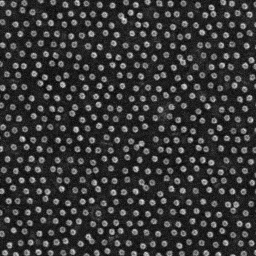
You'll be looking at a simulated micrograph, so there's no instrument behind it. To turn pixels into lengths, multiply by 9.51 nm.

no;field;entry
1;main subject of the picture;a regular array of raised bodies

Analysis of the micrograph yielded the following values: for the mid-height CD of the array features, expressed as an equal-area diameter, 51.5 nm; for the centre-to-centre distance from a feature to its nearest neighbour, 9.86 pixels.